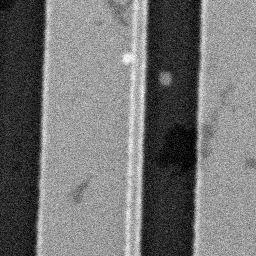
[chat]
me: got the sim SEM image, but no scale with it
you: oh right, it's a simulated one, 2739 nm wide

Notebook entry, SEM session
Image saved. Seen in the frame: lines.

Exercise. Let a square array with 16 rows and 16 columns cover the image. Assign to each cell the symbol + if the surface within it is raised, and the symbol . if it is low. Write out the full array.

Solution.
...++++++....+++
...++++++....+++
...++++++....+++
...++++++....+++
...++++++....+++
...++++++....+++
...++++++....+++
...++++++...++++
...++++++...++++
...++++++...++++
...++++++...++++
...++++++...++++
...++++++...++++
..+++++++...++++
..+++++++...++++
..+++++++...++++